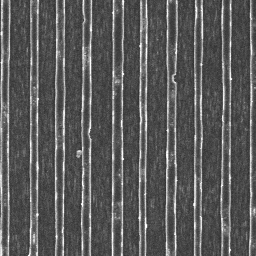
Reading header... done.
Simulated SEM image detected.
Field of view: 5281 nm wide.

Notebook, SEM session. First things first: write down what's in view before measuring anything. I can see parallel lines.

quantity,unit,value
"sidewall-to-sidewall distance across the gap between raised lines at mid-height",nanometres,408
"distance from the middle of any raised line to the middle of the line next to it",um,0.57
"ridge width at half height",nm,175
